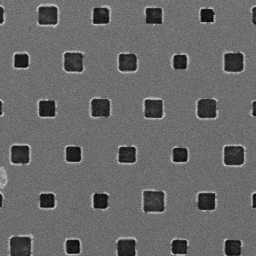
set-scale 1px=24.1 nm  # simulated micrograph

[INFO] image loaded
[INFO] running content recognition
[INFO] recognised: a regular array of holes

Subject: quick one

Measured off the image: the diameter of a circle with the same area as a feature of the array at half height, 18.7 pixels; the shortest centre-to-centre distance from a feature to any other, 1.27 µm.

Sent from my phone